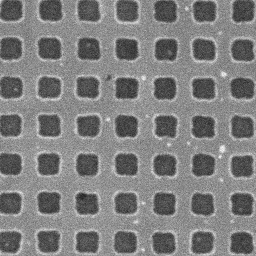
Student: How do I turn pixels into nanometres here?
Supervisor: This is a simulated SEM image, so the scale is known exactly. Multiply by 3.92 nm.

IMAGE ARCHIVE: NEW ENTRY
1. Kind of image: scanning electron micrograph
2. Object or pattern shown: a regular array of holes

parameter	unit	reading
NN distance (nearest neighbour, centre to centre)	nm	149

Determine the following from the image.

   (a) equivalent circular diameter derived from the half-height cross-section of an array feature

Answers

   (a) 100 nm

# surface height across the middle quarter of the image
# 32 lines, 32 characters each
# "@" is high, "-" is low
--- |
@@@@@@@@@@@@@@@@@@@@@@@@@@@@@@@@
@@@@@@@@@@@@@@@@@@@@@@@@@@@@@@@@
@@@@@@@@@@@@@@@@@@@@@@@@@@@@@@@@
@@@-----@@@@@-----@@@@@----@@@@@
@@@------@@@@------@@@------@@@@
@@@------@@@@------@@@------@@@@
@@@------@@@@------@@@------@@@@
@@@------@@@@------@@@------@@@@
@@@-----@@@@@-----@@@@@-----@@@@
@@@@@@@@@@@@@@@@@@@@@@@@@@@@@@@@
@@@@@@@@@@@@@@@@@@@@@@@@@@@@@@@@
@@@@@@@@@@@@@@@@@@@@@@@@@@@@@@@@
@@@@@@@-@@@@@@-@@@@@@@@@@@@@@@@@
@@@------@@@@-----@@@@@-----@@@@
@@@------@@@-------@@@-------@@@
@@@------@@@@------@@@------@@@@
@@@------@@@@------@@@------@@@@
@@@------@@@@------@@@@-----@@@@
@@@@@---@@@@@@-@@-@@@@@@@@--@@@@
@@@@@@@@@@@@@@@@@@@@@@@@@@@@@@@@
@@@@@@@@@@@@@@@@@@@@@@@@@@@@@@@@
@@@@@@@@@@@@@@@@@@@@@@@@@@@@@@@@
@@@@----@@@@@-----@@@@@----@@@@@
@@@------@@@@------@@@------@@@@
@@@------@@@@------@@@------@@@@
@@@------@@@@------@@@------@@@@
@@@------@@@@------@@@------@@@@
@@@------@@@@-----@@@@@-----@@@@
@@@@@@@@@@@@@@@@@@@@@@@@@@@@@@@@
@@@@@@@@@@@@@@@@@@@@@@@@@@@@@@@@
@@@@@@@@@@@@@@@@@@@@@@@@@@@@@@@@
@@@@@@@@@@@@@@@@@@@@@@@@@@@@@@@@